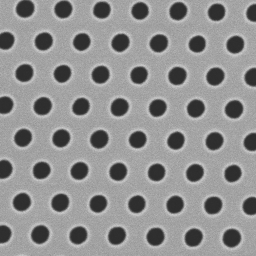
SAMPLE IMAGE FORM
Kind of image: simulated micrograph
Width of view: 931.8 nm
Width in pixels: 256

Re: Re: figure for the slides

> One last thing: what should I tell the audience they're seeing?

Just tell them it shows a regular array of holes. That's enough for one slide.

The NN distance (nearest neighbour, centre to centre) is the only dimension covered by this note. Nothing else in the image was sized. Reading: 135 nm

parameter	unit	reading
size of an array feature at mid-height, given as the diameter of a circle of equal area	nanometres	65.5